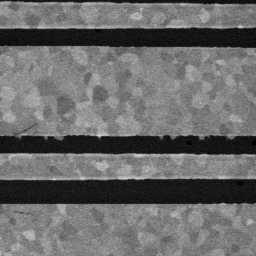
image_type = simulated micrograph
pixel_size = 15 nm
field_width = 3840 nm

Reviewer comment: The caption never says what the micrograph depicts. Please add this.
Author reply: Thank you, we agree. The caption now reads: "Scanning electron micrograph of lines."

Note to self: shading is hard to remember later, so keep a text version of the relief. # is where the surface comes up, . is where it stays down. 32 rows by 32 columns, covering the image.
#########..##...................
################################
################################
................................
................................
................................
################################
################################
################################
################################
################################
################################
################################
################################
################################
################################
################################
................................
................................
################################
################################
################################
................................
................................
................................
........................#..##.##
################################
################################
################################
################################
################################
################################